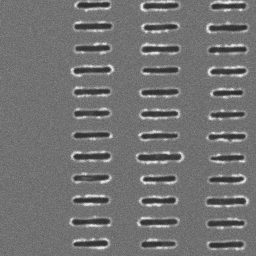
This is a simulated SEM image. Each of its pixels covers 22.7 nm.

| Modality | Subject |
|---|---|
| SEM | a regular array of holes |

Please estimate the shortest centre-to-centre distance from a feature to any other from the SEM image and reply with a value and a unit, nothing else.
487 nm